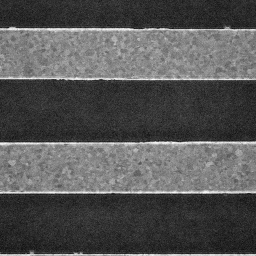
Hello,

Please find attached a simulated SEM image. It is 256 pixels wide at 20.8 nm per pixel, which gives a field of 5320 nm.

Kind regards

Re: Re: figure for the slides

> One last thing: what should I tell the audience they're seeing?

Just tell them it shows lines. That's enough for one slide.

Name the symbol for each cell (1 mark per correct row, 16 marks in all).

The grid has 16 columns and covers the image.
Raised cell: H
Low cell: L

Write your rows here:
LLLLLLLLLLLLLLLL
LLLLLLLLLLLLLLLL
HHHHHHHHHHHHHHHH
HHHHHHHHHHHHHHHH
HHHHHHHHHHHHHHHH
LLLLLLLLLLLLLLLL
LLLLLLLLLLLLLLLL
LLLLLLLLLLLLLLLL
LLLLLLLLLLLLLLLL
HHHHHHHHHHHHHHHH
HHHHHHHHHHHHHHHH
HHHHHHHHHHHHHHHH
LLLLLLLLLLLLLLLL
LLLLLLLLLLLLLLLL
LLLLLLLLLLLLLLLL
LLLLLLLLLLLLLLLL